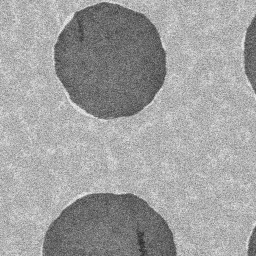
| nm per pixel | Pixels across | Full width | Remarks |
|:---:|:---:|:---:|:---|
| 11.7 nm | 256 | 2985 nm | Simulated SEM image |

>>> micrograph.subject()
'holes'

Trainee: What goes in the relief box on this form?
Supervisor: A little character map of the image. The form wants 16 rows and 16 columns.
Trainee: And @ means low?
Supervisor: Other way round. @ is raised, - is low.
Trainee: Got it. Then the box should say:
@@@@@---@@@@@@@@
@@@@------@@@@@@
@@@@------@@@@@-
@@@-------@@@@@-
@@@-------@@@@@-
@@@@------@@@@@@
@@@@@----@@@@@@@
@@@@@@@@@@@@@@@@
@@@@@@@@@@@@@@@@
@@@@@@@@@@@@@@@@
@@@@@@@@@@@@@@@@
@@@@@@@@@@@@@@@@
@@@@@----@@@@@@@
@@@@------@@@@@@
@@@--------@@@@@
@@@--------@@@@-